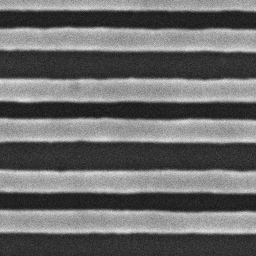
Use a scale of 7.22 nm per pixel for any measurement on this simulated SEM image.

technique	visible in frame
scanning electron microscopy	lines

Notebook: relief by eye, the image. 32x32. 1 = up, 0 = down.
11111111111111111111111111111111
00000000000000000000000000000000
00000000000000000000000000000000
00000000100010000000000000000000
11111111111111111111111111111111
11111111111111111111111111111111
00000000000000000000000000000000
00000000000000000000000000000000
00000000000000000000000000000000
00000000000000000000000000000000
11111111111111111111111111111111
11111111111111111111111111111111
11111111111111111111111111111111
00000000000000000000000000000000
00000000000000000000000000000000
11111111111111111111111111111111
11111111111111111111111111111111
11111111111111111111111111111111
00000000000000000000000000000000
00000000000000000000000000000000
00000000000000000000000000000000
11111110111111111111111111111101
11111111111111111111111111111111
11111111111111111111111111111111
00000000000000000000000000000000
00000000000000000000000000000000
11111111111111111111100000000010
11111111111111111111111111111111
11111111111111111111111111111111
00000000000000000000000000000000
00000000000000000000000000000000
00000000000000000000000000000000